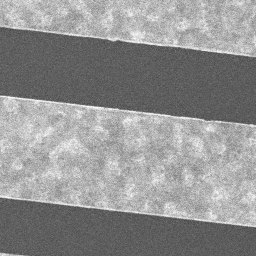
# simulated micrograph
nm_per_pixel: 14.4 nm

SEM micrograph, one or a few lines or trenches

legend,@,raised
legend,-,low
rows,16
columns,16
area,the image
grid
@@@@@@@@@@@@@@@@
@@@@@@@@@@@@@@@@
-------@@@@@@@@@
----------------
----------------
----------------
@@@@------------
@@@@@@@@@@@@@---
@@@@@@@@@@@@@@@@
@@@@@@@@@@@@@@@@
@@@@@@@@@@@@@@@@
@@@@@@@@@@@@@@@@
--@@@@@@@@@@@@@@
----------@@@@@@
----------------
----------------